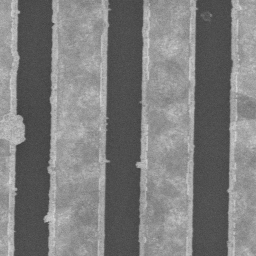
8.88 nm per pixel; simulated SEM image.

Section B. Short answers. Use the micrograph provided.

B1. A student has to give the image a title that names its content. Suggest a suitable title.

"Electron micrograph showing one or a few lines or trenches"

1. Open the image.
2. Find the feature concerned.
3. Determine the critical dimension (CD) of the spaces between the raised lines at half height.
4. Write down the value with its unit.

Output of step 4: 38.5 px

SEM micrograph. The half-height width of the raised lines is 453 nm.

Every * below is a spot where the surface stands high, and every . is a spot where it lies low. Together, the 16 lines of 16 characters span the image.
*..****..***...*
*..****..***...*
*..****..***...*
*..****..***...*
*..****..***...*
*..****..***...*
*..***...***...*
*..****..***..**
**.***...***..**
*..***...***...*
*..****..***..**
*..***...***..**
*..***...***..**
*..***...***..**
*..***...***..**
*..***...***..**